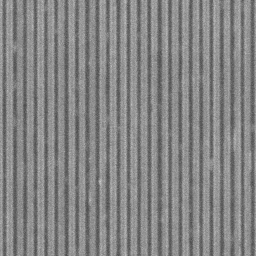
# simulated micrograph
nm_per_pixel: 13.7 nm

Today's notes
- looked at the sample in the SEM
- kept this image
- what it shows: parallel lines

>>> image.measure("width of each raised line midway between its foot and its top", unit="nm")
73.6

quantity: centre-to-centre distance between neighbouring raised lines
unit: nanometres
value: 142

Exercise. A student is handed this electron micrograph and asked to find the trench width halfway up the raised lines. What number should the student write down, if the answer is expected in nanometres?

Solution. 73.6